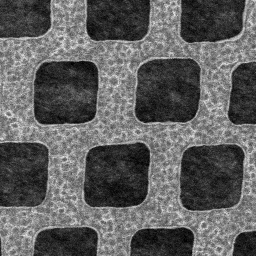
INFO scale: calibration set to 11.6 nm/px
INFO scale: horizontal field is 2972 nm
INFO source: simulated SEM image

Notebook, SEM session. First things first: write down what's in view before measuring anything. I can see holes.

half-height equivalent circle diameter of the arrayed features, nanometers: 819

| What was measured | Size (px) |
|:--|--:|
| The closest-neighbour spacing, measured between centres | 95.6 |